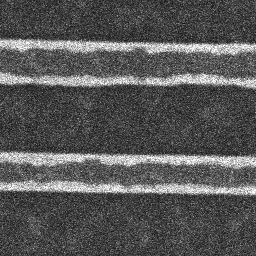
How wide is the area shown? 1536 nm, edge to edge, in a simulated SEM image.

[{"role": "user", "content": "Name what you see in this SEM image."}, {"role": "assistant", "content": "one or a few lines or trenches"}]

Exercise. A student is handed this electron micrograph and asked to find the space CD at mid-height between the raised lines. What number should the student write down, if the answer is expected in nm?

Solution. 446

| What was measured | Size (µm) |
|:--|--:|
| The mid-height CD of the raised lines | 0.208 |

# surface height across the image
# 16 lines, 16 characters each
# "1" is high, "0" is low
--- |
0000000000000000
0000000000000000
0000000000000000
1111111111111111
1111111111111111
0000000000000000
0000000000000000
0000000000000000
0000000000000000
0000000000000000
1111111111111111
1111111111111111
0000000000000000
0000000000000000
0000000000000000
0000000000000000